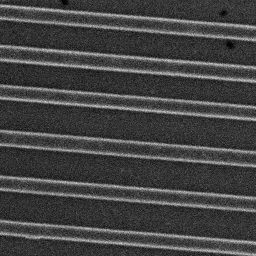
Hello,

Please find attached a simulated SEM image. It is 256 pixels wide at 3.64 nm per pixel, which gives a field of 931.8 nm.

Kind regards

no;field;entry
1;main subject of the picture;parallel lines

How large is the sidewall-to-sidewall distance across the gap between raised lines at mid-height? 0.11 um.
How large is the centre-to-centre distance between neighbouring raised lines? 156 nm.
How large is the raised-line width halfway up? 0.0499 um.